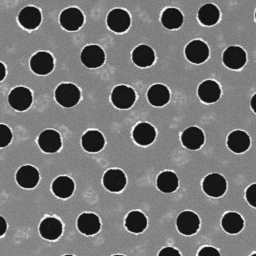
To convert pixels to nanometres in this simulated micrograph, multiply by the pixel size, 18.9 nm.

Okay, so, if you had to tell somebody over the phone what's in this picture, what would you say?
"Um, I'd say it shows a regular array of holes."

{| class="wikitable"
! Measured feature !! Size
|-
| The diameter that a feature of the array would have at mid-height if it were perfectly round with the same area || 439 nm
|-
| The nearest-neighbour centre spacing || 784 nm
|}